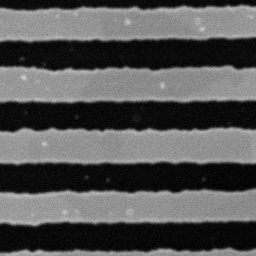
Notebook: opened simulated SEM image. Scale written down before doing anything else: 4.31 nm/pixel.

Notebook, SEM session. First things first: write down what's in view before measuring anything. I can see lines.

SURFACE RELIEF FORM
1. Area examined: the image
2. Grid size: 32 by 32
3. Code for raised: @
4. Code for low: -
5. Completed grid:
--------------------------------
@@@@@@@@@@@@@@@@@@@@@@@@@@@@@@@@
@@@@@@@@@@@@@@@@@@@@@@@@@@@@@@@@
@@@@@@@@@@@@@@@@@@@@@@@@@@@@@@@@
@@@@@@@@@@@@@@@@@@@@@@@@@@@@@@@@
--------------------------------
--------------------------------
--------------------------------
@@@----------------------@@@@---
@@@@@@@@@@@@@@@@@@@@@@@@@@@@@@@@
@@@@@@@@@@@@@@@@@@@@@@@@@@@@@@@@
@@@@@@@@@@@@@@@@@@@@@@@@@@@@@@@@
@@@@@@@@@@@@@@@@@@@@@@@@@@@@@@@-
--------------------------------
--------------------------------
--------------------------------
--@@@@@@@@@@@@@@@@@@@@@@@@@@@@@@
@@@@@@@@@@@@@@@@@@@@@@@@@@@@@@@@
@@@@@@@@@@@@@@@@@@@@@@@@@@@@@@@@
@@@@@@@@@@@@@@@@@@@@@@@@@@@@@@@@
--------------------------------
--------------------------------
--------------------------------
--------------------------------
@@@@@@@@@@@@@@@@@@@@@@@@@@@@@@@@
@@@@@@@@@@@@@@@@@@@@@@@@@@@@@@@@
@@@@@@@@@@@@@@@@@@@@@@@@@@@@@@@@
@@@@@@@@@@@@@@@@@@@@@@@@@@@@@@@@
--------------------------------
--------------------------------
--------------------------------
--@@@@---@@-@---@--@@@-@-@@@@@-@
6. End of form